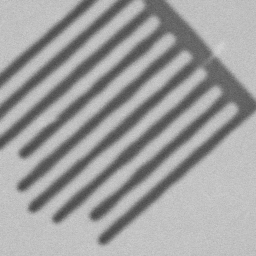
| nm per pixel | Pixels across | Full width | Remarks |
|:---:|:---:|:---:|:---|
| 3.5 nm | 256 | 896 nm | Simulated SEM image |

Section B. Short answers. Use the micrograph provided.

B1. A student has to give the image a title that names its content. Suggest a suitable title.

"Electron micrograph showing groups of lines, slits or small figures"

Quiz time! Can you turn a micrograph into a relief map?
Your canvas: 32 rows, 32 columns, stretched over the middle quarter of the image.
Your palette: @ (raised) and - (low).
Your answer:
@@@-----@@@@@---@@@@@----@@@@@--
@@-----@@@@@---@@@@@----@@@@@---
@@----@@@@----@@@@@----@@@@@----
-----@@@@----@@@@@----@@@@@----@
---@@@@@----@@@@@----@@@@@----@@
--@@@@@----@@@@-----@@@@@---@@@@
-@@@@@----@@@@-----@@@@@---@@@@@
@@@@@----@@@@-----@@@@----@@@@@-
@@@----@@@@@-----@@@@----@@@@@--
@@----@@@@@-----@@@@----@@@@@---
@----@@@@@----@@@@@----@@@@@----
----@@@@@----@@@@@----@@@@-----@
---@@@@@----@@@@-----@@@@-----@@
--@@@@@----@@@@-----@@@@----@@@@
-@@@@@----@@@@-----@@@@----@@@@@
@@@@-----@@@@-----@@@@----@@@@@-
@@@----@@@@@----@@@@@----@@@@@--
@@----@@@@@----@@@@@----@@@@@---
@----@@@@@----@@@@@----@@@@-----
----@@@@@----@@@@-----@@@@-----@
---@@@@@----@@@@----@@@@@----@@@
--@@@@@---@@@@@-----@@@@----@@@@
-@@@@@---@@@@@-----@@@@----@@@@@
@@@@@---@@@@@-----@@@@----@@@@@-
@@@----@@@@@----@@@@@----@@@@@--
@@----@@@@@----@@@@-----@@@@----
@----@@@@@---@@@@@-----@@@@----@
----@@@@@---@@@@@-----@@@@----@@
---@@@@@---@@@@@-----@@@@----@@@
--@@@@@---@@@@@-----@@@@----@@@@
-@@@@----@@@@@----@@@@@----@@@@@
@@@@----@@@@@----@@@@@----@@@@@@